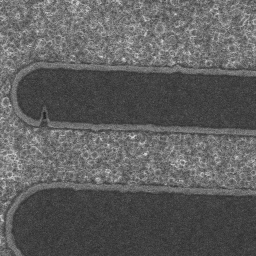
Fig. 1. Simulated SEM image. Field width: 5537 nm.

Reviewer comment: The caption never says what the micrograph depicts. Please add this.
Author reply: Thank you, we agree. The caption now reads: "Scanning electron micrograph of one or a few lines or trenches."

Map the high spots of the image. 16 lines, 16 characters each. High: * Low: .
................
................
................
................
.*************..
.***************
.***************
...*************
................
................
................
................
.***************
.***************
.***************
.***************